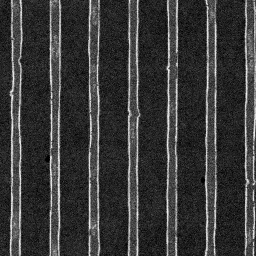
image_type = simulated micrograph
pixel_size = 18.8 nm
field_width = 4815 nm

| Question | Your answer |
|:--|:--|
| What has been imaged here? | parallel lines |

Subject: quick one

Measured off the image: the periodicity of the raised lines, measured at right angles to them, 734 nanometers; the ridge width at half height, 167 nm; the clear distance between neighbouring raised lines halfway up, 0.562 um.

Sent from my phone